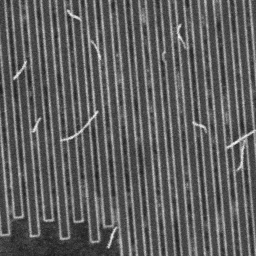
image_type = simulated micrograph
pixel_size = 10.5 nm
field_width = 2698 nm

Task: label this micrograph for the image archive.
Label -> parallel lines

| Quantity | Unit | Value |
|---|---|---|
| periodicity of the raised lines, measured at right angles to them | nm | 156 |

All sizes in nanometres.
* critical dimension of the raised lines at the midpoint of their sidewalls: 74.8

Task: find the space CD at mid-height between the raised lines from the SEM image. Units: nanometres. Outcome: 84